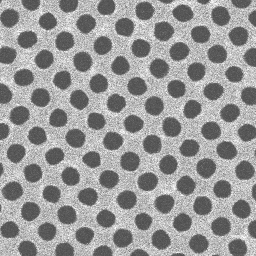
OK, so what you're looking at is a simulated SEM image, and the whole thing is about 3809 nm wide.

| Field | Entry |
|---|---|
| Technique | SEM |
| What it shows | a regular array of holes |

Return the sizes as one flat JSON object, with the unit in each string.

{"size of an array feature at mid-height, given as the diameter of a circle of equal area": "283 nm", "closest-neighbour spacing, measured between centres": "0.388 microns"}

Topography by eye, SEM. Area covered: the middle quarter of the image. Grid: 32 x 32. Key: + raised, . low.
+++....+++++.....++++.....+++++.
+++...++++++....+++++.....+++++.
..++++++.++++..+++++++...++++++.
..+++++...+++++++..++++++++++++.
..++++.....+++++....++++++....++
.+++++.....+++++.....+++++....++
+++++++....+++++.....+++++....++
++...+++++++.++++...++++++....++
++....+++++....++++++...++++.+++
+.....+++++.....++++.....++++++.
++....+++++.....++++.....+++++..
+++.++++++++..++++++.....+++++..
.+++++...++++++++++++...++++++..
.+++++....++++++...+++++++..+++.
.+++++.....++++.....+++++....+++
++++++....+++++.....+++++....+++
++..++++.++++++....++++++....+++
+....++++++...+++++++++++....+++
.....+++++.....+++++....++++++++
+....+++++.....+++++....++++++..
+...++++++....++++++....+++++...
+++++++++++..+++++++....+++++...
+++++....++++++...+++++++++++...
++++.....+++++.....++++++...++++
+++++....+++++.....+++++....++++
++++++...+++++.....+++++....++++
...++++++++++++...++++++....++++
....+++++....+++++++...++..+++++
....+++++.....+++++....++++++...
....+++++.....++++......++++....
+.++++++++...++++++....+++++....
++++....++++++++++++..++++++....